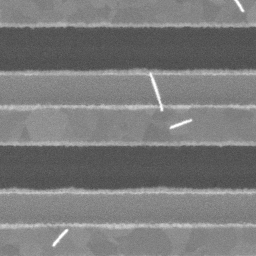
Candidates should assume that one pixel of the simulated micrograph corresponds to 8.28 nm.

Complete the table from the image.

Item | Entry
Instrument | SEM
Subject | lines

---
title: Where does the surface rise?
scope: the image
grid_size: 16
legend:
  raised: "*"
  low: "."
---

****************
****************
................
................
................
****************
****************
****************
****************
................
................
................
****************
****************
****************
****************